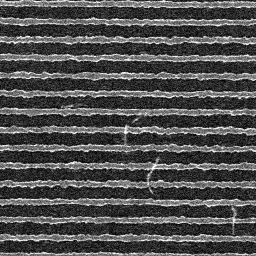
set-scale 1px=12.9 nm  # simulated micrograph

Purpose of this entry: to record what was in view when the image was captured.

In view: parallel lines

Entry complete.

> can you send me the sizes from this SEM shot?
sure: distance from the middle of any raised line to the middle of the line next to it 0.232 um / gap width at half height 169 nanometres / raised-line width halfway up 0.0676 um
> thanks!